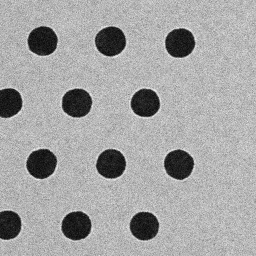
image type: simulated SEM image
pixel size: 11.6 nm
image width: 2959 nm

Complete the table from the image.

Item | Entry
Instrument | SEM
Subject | a regular array of holes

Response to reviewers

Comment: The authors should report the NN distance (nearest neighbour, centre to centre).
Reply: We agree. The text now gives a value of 791 nm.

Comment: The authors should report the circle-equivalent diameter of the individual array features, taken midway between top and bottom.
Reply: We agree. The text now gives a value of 350 nanometres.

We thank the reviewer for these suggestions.